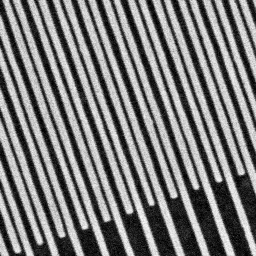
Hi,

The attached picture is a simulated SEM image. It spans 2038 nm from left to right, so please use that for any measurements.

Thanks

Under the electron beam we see parallel lines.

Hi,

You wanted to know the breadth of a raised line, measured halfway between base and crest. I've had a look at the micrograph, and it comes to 47 nm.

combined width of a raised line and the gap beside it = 94.1 nm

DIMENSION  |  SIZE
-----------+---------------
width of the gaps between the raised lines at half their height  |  47.9 nanometers